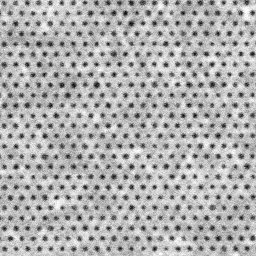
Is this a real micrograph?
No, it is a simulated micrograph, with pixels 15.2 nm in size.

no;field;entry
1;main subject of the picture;a regular array of holes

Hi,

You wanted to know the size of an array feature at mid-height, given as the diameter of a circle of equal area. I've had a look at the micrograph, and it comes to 100 nm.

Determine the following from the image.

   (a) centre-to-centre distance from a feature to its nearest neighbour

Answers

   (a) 174 nanometers